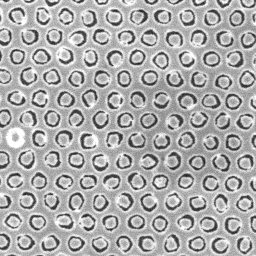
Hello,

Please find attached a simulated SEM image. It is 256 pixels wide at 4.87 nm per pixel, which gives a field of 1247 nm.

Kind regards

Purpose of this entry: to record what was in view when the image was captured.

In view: a regular array of ring-shaped grooves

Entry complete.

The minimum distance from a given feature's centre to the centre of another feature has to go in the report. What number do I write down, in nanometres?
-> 106